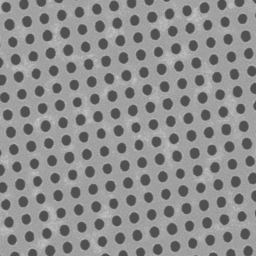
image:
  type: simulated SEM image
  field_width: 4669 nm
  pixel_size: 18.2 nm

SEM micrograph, a regular array of holes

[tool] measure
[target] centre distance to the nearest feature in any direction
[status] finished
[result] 0.32 micrometres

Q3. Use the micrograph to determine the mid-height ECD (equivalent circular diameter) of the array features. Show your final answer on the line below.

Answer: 194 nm